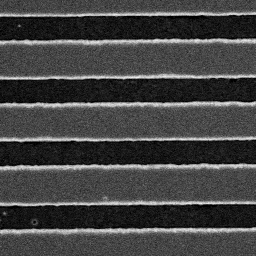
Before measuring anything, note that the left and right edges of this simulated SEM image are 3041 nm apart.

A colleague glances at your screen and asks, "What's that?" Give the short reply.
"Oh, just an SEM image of lines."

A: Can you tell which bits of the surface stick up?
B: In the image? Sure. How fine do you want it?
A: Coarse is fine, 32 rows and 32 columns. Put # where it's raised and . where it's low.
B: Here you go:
################################
################################
................................
................................
................................
################################
################################
################################
################################
################################
................................
................................
................................
################################
################################
################################
################################
#################.##............
................................
................................
.........................#...##.
################################
################################
################################
################################
########################.#......
................................
................................
...............................#
################################
################################
################################